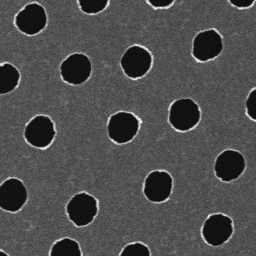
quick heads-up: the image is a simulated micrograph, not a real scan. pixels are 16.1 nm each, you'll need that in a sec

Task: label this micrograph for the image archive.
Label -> a regular array of holes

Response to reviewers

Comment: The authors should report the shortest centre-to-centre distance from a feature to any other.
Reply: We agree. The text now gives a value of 1.05 µm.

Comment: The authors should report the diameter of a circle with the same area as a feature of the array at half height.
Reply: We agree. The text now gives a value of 486 nm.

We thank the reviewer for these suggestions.